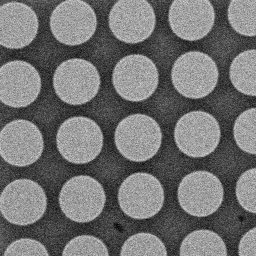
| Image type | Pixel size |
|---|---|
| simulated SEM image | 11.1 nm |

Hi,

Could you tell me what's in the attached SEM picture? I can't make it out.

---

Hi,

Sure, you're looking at an array of small figures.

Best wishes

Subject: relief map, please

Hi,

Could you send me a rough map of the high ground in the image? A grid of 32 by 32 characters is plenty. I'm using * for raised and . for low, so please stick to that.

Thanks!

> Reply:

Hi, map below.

.**.....***....****...****...***
****...*****..*****..******..***
*****.******..*****..******..***
*****.******..*****..*****...***
****...****...*****...***.......
***.....*.......................
...............................*
.........*.....****...****...***
****...*****..*****...*****..***
*****..*****..******..*****..***
*****..*****..******..*****..***
*****..*****...****...****....**
****....***.....**..............
................................
................**.....***....**
.***....****...*****..*****..***
*****..******.******..*****..***
*****..******.******..*****..***
*****..******..*****..*****...**
*****...****....***.....*.......
.***............................
.........................*.....*
...*.....***....****...****...**
.****...*****..*****..******..**
******.******..*****..******..**
******..*****..*****...*****..**
*****...****....****...****.....
.****....**.....................
................................
..........*......**.....***....*
..***....****...****...*****..**
.*****..*****..******..*****..**